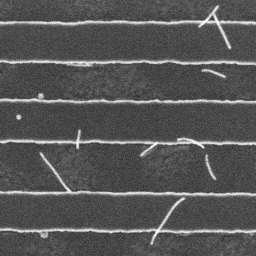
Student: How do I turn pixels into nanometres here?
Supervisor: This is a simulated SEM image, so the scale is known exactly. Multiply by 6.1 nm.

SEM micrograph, lines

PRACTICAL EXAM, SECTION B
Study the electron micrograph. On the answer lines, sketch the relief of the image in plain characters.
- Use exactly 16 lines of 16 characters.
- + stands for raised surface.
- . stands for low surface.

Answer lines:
................
++++++++++++++++
++++++++++++++++
++++++++++++++++
................
................
++++++++++++++++
++++++++++++++++
++++++++++++++++
................
................
................
++++++++++++++++
++++++++++++++++
...........+..+.
................